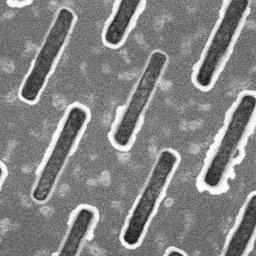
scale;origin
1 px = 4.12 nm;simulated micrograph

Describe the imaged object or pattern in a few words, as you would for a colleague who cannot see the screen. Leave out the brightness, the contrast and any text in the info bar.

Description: holes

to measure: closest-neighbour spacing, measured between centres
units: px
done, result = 98.4